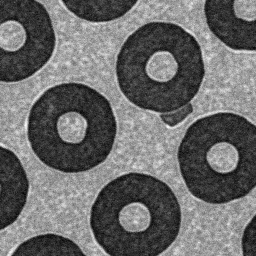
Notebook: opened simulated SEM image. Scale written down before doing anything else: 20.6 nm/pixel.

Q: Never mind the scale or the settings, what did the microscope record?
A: ring-shaped grooves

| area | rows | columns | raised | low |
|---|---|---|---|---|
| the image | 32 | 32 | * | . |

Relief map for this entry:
.....***.........********....***
......***.......**********...***
......*****...************......
***....**********......***......
***....*********........***.....
***....********..........***....
.......********..........*******
......*********....***...*******
.....*********....****....******
....**********.....***....******
*******...*****..........*******
*****.......***..........*******
****.........***........********
****..........***.......********
****....**....******....*.....**
***....****....******.**........
***....****....********.........
***.....**....*********.........
.***..........********....***...
..***.........********....****..
...***.......*********....***...
...*****..************..........
....**********......***.........
....*********........**.........
...*********..........**.......*
...*********....*.....****..****
...********....****....*********
..*********....****....********.
.**********.....**.....********.
****....****..........********..
***.......**.........*********..
**........***........*********..